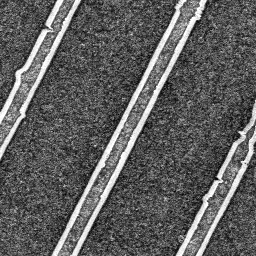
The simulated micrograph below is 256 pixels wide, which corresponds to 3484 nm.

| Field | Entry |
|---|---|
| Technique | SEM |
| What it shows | one or a few lines or trenches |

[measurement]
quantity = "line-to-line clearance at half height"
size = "1280 nm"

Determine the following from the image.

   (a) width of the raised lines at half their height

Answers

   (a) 247 nm